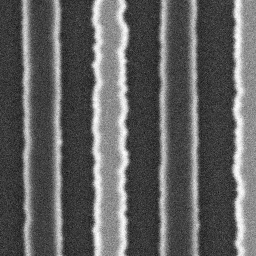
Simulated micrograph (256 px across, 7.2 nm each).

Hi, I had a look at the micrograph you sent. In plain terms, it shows lines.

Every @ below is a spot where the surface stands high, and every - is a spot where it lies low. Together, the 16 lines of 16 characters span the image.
-@@@--@@--@@---@
-@@@--@@--@@---@
--@@--@@--@@---@
--@@--@@--@@---@
--@@--@@--@@---@
--@@--@@--@@---@
--@@--@@--@@---@
--@@--@@--@@---@
--@@--@@--@@---@
--@@--@@--@@---@
--@@--@@--@@---@
--@@--@@--@@---@
--@@--@@--@@---@
--@@--@@--@@---@
--@@--@@--@@---@
--@@--@@--@@---@